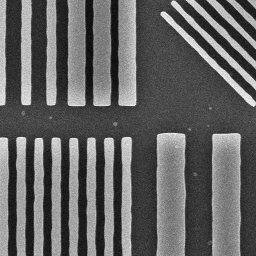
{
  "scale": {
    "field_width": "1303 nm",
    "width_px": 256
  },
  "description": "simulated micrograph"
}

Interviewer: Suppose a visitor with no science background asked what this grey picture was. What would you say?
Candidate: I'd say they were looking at groups of lines, slits or small figures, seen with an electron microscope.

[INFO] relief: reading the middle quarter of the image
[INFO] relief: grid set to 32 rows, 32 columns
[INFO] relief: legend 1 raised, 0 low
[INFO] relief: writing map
01111001111100111100000000000000
01111001111100111100000000000000
01111001111100111100000000000000
01111001111100111100000000000000
01111001111100111100000000000000
01111001111100111100000000000000
01111001111100111100000000000000
01111001111100111100000000000000
01111001111100111100000000000000
01111001111100111100000000000000
00000000000000000000000000000000
00000000000000000000000000000000
00000000000000000000000000000000
00000000000000000000000000000000
00000000000000000000000000000000
00000000000000000000000000000000
00000000000000000000000000000000
00000000000000000000000001110000
00000000000000010000000111111100
01100011001100011000000111111100
01110011001100011000000111111100
00110011001100011000000111111100
00110011001100011000000111111100
00110011001100011000000111111100
00110011001100011000000111111100
00110011001100010000000111111100
00110011001100010000000111111100
00100011001100010000000111111100
01100011001100011000000111111100
01110011001100011000000111111100
01110011001100011000000111111100
01110011001100011000000111111100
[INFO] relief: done